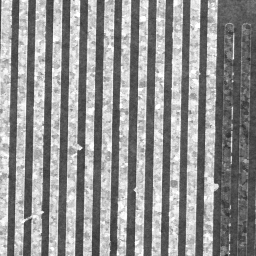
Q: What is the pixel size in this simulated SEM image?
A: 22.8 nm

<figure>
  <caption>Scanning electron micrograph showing parallel lines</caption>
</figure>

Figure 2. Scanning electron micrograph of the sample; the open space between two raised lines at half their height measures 8.12 px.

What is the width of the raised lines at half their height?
205 nm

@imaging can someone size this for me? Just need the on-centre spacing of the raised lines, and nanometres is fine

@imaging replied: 392